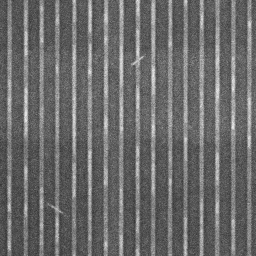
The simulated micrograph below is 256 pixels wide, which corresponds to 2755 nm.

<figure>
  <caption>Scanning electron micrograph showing parallel lines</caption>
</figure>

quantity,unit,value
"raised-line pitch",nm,172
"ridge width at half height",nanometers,36.3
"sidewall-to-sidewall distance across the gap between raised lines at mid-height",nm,137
